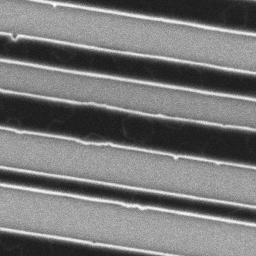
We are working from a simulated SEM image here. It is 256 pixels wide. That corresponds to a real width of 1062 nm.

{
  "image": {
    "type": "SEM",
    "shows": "one or a few lines or trenches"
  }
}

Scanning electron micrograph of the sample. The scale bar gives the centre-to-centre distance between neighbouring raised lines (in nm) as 265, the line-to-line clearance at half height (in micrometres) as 0.155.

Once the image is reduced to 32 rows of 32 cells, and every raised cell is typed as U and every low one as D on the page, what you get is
DDDDDDDUUUUUUUUUUUUUUUUUUUUUUUUU
DDDDDDDDDDDDDDUUUUUUUUUUUUUUUUUU
DDDDDDDDDDDDDDDDDDDDUUUUUUUUUUUU
DDDDDDDDDDDDDDDDDDDDDDDDDDUUUUUU
UDUDDDDDDDDDDDDDDDDDDDDDDDDDDDDD
UUUUUUUUUDDDDDDDDDDDDDDDDDDDDDDD
UUUUUUUUUUUUUUUDDDDDDDDDDDDDDDDD
UUUUUUUUUUUUUUUUUUUUUUDDDDDDDDDD
DDDDDDUUUUUUUUUUUUUUUUUUUUUUDDDD
DDDDDDDDDDDDUUUUUUUUUUUUUUUUUUUU
DDDDDDDDDDDDDDDDDDDUUUUUUUUUUUUU
UUDDDDDDDDDDDDDDDDDDDDDDDUUUUUUU
UUUUUUUUDDDDDDDDDDDDDDDDDDDDDDDD
UUUUUUUUUUUUUUUDDDDDDDDDDDDDDDDD
UUUUUUUUUUUUUUUUUUUUDDDDDDDDDDDD
UUUUUUUUUUUUUUUUUUUUUUUUUUUDDDDD
DDUUUUUUUUUUUUUUUUUUUUUUUUUUUUUU
DDDDDDDDDUUUUUUUUUUUUUUUUUUUUUUU
DDDDDDDDDDDDDDDDUUUUUUUUUUUUUUUU
DDDDDDDDDDDDDDDDDDDDDDUUUUUUUUUU
DDDDDDDDDDDDDDDDDDDDDDDDDDDDDUUU
UUUUDDDDDDDDDDDDDDDDDDDDDDDDDDDD
UUUUUUUUUUUDDDDDDDDDDDDDDDDDDDDD
DDUUUUUUUUUUUUUUUDDDDDDDDDDDDDDD
DDDDDDDDDUUUUUUUUUUUUUUUDDDDDDDD
DDDDDDDDDDDDDDDUUUUUUUUUUUUUUUDD
DDDDDDDDDDDDDDDDDDDDDDUUUUUUUUUU
DDDDDDDDDDDDDDDDDDDDDDDDDDDDUUUU
DDDDDDDDDDDDDDDDDDDDDDDDDDDDDDDD
UUUUUUDDDDDDDDDDDDDDDDDDDDDDDDDD
UUUUUUUUUUUUDDDDDDDDDDDDDDDDDDDD
UUUUUUUUUUUUUUUUUUUDDDDDDDDDDDDD